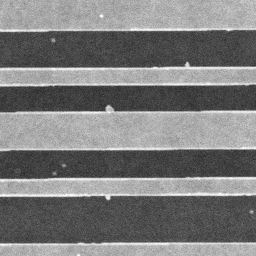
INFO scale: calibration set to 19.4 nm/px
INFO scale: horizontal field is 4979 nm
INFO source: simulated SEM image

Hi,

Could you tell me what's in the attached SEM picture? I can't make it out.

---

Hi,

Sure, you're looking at lines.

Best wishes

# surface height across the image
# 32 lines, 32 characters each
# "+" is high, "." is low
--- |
++++++++++++++++++++++++++++++++
++++++++++++++++++++++++++++++++
++++++++++++++++++++++++++++++++
++++++++++++++++++++++++++++++++
................................
................................
................................
................................
.....................+++++++++++
++++++++++++++++++++++++++++++++
+++++++++++++++++++++++++++++...
................................
................................
................................
++++++++++++++++++++++++++++++++
++++++++++++++++++++++++++++++++
++++++++++++++++++++++++++++++++
++++++++++++++++++++++++++++++++
++++++++++++++++++++++++++++++++
................................
................................
................................
++++++++++++++++++++++++++++++++
++++++++++++++++++++++++++++++++
................................
................................
................................
................................
................................
................................
..................++++++++++++++
++++++++++++++++++++++++++++++++